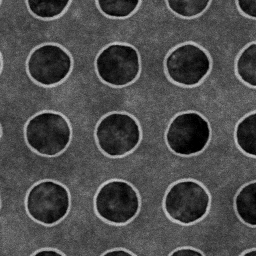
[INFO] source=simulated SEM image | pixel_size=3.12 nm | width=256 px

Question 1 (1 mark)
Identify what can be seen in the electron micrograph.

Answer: a regular array of holes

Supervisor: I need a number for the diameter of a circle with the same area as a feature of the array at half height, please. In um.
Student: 0.135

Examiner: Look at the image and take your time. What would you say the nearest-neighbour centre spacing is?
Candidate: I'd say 215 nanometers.